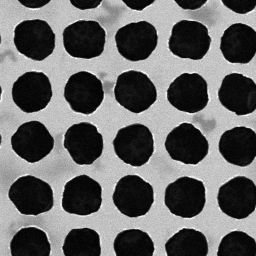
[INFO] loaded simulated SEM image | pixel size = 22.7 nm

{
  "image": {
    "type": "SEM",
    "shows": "a regular array of holes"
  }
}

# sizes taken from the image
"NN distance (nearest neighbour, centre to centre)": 1160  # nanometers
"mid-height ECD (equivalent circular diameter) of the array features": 937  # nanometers